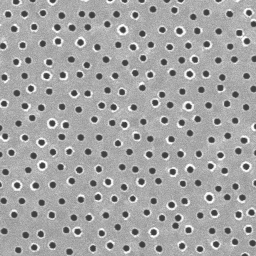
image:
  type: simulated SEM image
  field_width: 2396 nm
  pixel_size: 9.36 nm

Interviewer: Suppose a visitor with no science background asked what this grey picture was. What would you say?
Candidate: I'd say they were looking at a regular array of holes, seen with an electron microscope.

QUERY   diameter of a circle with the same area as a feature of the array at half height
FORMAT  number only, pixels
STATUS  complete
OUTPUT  6.49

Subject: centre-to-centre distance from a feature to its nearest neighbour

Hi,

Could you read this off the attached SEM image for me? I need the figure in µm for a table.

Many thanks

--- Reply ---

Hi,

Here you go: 0.138